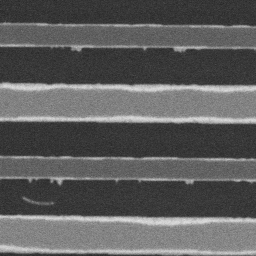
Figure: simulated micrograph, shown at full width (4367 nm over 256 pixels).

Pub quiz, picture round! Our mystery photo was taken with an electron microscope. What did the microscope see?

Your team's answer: lines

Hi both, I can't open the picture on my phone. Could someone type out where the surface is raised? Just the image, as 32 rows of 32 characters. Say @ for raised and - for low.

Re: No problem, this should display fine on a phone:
--------------------------------
--------------------------------
--------------------------------
@@@@@@@@@@@@@@@@@@@@@@@@@@@@@@@@
@@@@@@@@@@@@@@@@@@@@@@@@@@@@@@@@
@@@@@@@@@@@@@@@@@@@@@@@@@@@@@@@@
--------------------------------
--------------------------------
--------------------------------
--------------------------------
--------------------------------
@@@@@@@@@@@@@@@@@@@@@@@@@@@@@@@@
@@@@@@@@@@@@@@@@@@@@@@@@@@@@@@@@
@@@@@@@@@@@@@@@@@@@@@@@@@@@@@@@@
@@@@@@@@@@@@@@@@@@@@@@@@@@@@@@@@
--------------------------------
--------------------------------
--------------------------------
--------------------------------
--------------------------------
@@@@@@@@@@@@@@@@@@@@@@@@@@@@@@@@
@@@@@@@@@@@@@@@@@@@@@@@@@@@@@@@@
-----------------------------@@@
--------------------------------
--------------------------------
--------------------------------
--------------------------------
@@@@@@@@@@@@@@@@@@@@@@@@@@@@@@@@
@@@@@@@@@@@@@@@@@@@@@@@@@@@@@@@@
@@@@@@@@@@@@@@@@@@@@@@@@@@@@@@@@
@@@@@@@@@@@@@@@@@@@@@@@@@@@@@@@@
---------@@@-@@@@@@@@@@@@@@@@@@@